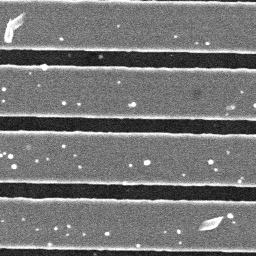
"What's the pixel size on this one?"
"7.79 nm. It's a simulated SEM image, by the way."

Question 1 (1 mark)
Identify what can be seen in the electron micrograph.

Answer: lines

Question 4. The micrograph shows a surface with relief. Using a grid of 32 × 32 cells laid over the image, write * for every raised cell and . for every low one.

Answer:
********************************
********************************
********************************
********************************
********************************
********************************
.......................*********
................................
*********************...*.......
********************************
********************************
********************************
********************************
********************************
....****************************
................................
**********......................
********************************
********************************
********************************
********************************
********************************
********************************
................................
................................
********************************
********************************
********************************
********************************
********************************
********************************
................................